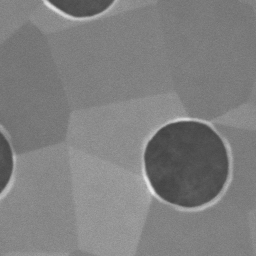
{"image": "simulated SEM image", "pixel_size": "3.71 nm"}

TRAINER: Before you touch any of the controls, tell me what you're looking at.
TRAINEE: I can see holes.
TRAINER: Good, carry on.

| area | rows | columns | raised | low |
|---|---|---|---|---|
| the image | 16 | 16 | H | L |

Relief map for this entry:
HHHHLLLHHHHHHHHH
HHHHHHHHHHHHHHHH
HHHHHHHHHHHHHHHH
HHHHHHHHHHHHHHHH
HHHHHHHHHHHHHHHH
HHHHHHHHHHHHHHHH
HHHHHHHHHHHHHHHH
HHHHHHHHHHHHHHHH
HHHHHHHHHHLLLLHH
LHHHHHHHHLLLLLHH
LHHHHHHHHLLLLLHH
HHHHHHHHHLLLLLHH
HHHHHHHHHHLLLHHH
HHHHHHHHHHHHHHHH
HHHHHHHHHHHHHHHH
HHHHHHHHHHHHHHHH